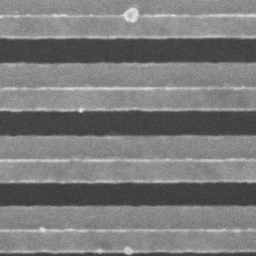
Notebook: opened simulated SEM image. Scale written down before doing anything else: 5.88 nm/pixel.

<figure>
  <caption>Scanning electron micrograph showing lines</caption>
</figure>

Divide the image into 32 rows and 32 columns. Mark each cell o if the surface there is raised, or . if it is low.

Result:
oooooooooooooooooooooooooooooooo
oooooooooooooooooooooooooooooooo
oooooooooooooooooooooooooooooooo
oooooooooooooooooooooooooooooooo
oooooooooooooooooooooooooooooooo
................................
................................
................................
oooooooooooooooooooooooooooooooo
oooooooooooooooooooooooooooooooo
oooooooooooooooooooooooooooooooo
oooooooooooooooooooooooooooooooo
oooooooooooooooooooooooooooooooo
oooooooooooooooooooooooooooooooo
................................
................................
................................
oooooooooooooooooooooooooooooooo
oooooooooooooooooooooooooooooooo
oooooooooooooooooooooooooooooooo
oooooooooooooooooooooooooooooooo
oooooooooooooooooooooooooooooooo
oooooooooooooooooooooooooooooooo
................................
................................
................................
oooooooooooooooooooooooooooooooo
oooooooooooooooooooooooooooooooo
oooooooooooooooooooooooooooooooo
oooooooooooooooooooooooooooooooo
oooooooooooooooooooooooooooooooo
ooooooooooooooooooo.oooooooooo..